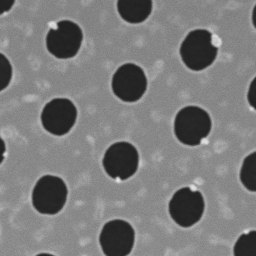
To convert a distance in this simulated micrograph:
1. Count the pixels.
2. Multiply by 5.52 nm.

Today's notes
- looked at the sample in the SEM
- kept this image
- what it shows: a regular array of holes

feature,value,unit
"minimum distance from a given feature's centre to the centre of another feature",422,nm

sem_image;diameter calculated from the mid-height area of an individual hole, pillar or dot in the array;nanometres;204